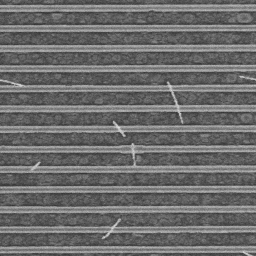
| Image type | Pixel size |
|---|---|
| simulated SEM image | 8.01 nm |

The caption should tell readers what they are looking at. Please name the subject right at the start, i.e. parallel lines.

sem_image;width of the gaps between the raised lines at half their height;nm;120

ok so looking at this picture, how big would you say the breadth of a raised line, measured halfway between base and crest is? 37 nm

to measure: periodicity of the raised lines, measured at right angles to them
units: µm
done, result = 0.161